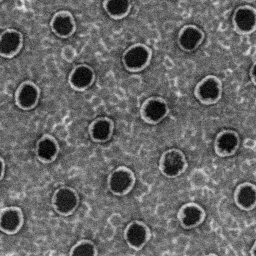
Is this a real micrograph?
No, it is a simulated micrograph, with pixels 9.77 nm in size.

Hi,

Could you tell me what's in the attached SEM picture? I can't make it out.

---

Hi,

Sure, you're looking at a regular array of raised bodies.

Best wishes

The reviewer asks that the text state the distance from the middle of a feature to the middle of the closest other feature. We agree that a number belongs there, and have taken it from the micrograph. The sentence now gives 540 nm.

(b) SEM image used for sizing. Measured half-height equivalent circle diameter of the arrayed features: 245 nm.